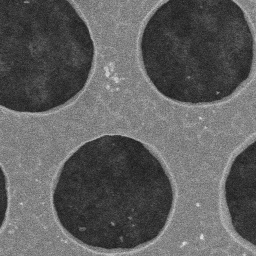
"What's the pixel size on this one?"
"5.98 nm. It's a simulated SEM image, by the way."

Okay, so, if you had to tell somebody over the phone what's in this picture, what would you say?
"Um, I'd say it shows holes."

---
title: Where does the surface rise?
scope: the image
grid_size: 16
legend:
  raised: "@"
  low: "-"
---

-----@@@@@-----@
-----@@@@-------
------@@@-------
------@@@-------
------@@@-------
-----@@@@@-----@
----@@@@@@@--@@@
@@@@@@@@@@@@@@@@
@@@@@@@-@@@@@@@@
@@@@@-----@@@@@-
@@@@------@@@@--
@@@--------@@@--
@@@--------@@@--
@@@@-------@@@--
@@@@------@@@@@-
@@@@@@---@@@@@@@